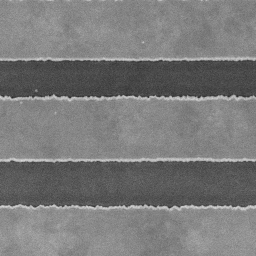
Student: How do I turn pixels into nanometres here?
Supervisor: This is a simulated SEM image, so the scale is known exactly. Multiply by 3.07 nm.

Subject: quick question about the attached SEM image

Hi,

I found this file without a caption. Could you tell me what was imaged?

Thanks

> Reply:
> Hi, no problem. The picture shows lines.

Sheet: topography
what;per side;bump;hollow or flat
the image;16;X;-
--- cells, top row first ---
XXXXXXXXXXXXXXXX
XXXXXXXXXXXXXXXX
XXXXXXXXXXXXXXXX
XXXXXXXXXXXXXXXX
----------------
----------------
XXXXXXXXXXXXXXXX
XXXXXXXXXXXXXXXX
XXXXXXXXXXXXXXXX
XXXXXXXXXXXXXXXX
----------------
----------------
----------------
XXXXXXXXXXXXXXXX
XXXXXXXXXXXXXXXX
XXXXXXXXXXXXXXXX